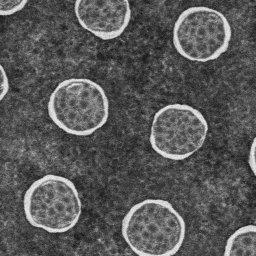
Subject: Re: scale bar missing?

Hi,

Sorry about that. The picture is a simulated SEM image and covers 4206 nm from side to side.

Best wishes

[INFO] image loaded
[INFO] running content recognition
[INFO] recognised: raised bodies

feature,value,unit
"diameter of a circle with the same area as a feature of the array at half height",873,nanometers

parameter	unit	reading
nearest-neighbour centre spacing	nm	1660